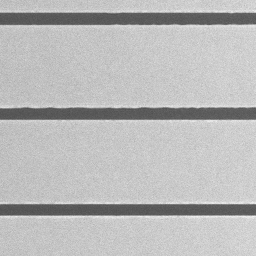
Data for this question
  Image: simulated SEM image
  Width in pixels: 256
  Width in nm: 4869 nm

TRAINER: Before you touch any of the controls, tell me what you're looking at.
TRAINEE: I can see lines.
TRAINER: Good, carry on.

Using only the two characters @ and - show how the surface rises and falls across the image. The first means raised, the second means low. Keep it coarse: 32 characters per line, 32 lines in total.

@@@@@@@@@@@@@@@@@@@@@@@@@@@@@@@@
-------------@@-------------@---
--------------------------------
@@@@@@@@@@@@@@@@@@@@@@@@@@@@@@@@
@@@@@@@@@@@@@@@@@@@@@@@@@@@@@@@@
@@@@@@@@@@@@@@@@@@@@@@@@@@@@@@@@
@@@@@@@@@@@@@@@@@@@@@@@@@@@@@@@@
@@@@@@@@@@@@@@@@@@@@@@@@@@@@@@@@
@@@@@@@@@@@@@@@@@@@@@@@@@@@@@@@@
@@@@@@@@@@@@@@@@@@@@@@@@@@@@@@@@
@@@@@@@@@@@@@@@@@@@@@@@@@@@@@@@@
@@@@@@@@@@@@@@@@@@@@@@@@@@@@@@@@
@@@@@@@@@@@@@@@@@@@@@@@@@@@@@@@@
--------------------------------
--------------------------------
@@@@@@@@@@@@@@@@@@@@@@@@@@@@@@@@
@@@@@@@@@@@@@@@@@@@@@@@@@@@@@@@@
@@@@@@@@@@@@@@@@@@@@@@@@@@@@@@@@
@@@@@@@@@@@@@@@@@@@@@@@@@@@@@@@@
@@@@@@@@@@@@@@@@@@@@@@@@@@@@@@@@
@@@@@@@@@@@@@@@@@@@@@@@@@@@@@@@@
@@@@@@@@@@@@@@@@@@@@@@@@@@@@@@@@
@@@@@@@@@@@@@@@@@@@@@@@@@@@@@@@@
@@@@@@@@@@@@@@@@@@@@@@@@@@@@@@@@
@@@@@@@@@@@@@@@@@@@@@@@@@@@@@@@@
--------------------------------
--------------------------------
@@@@@@@@@@@@@@@@@@@@@@@@@@@@@@@@
@@@@@@@@@@@@@@@@@@@@@@@@@@@@@@@@
@@@@@@@@@@@@@@@@@@@@@@@@@@@@@@@@
@@@@@@@@@@@@@@@@@@@@@@@@@@@@@@@@
@@@@@@@@@@@@@@@@@@@@@@@@@@@@@@@@